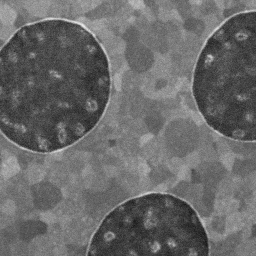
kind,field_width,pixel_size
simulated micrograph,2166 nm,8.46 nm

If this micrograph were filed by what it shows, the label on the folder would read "holes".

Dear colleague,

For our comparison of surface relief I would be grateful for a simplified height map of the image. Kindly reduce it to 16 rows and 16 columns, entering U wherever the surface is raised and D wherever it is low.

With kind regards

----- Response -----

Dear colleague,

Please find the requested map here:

UUUUUUUUUUUUUUUU
UUDDDUUUUUUUUUDD
UDDDDDUUUUUUUDDD
DDDDDDDUUUUUDDDD
DDDDDDDUUUUUDDDD
DDDDDDDUUUUUDDDD
DDDDDDDUUUUUDDDD
DDDDDDUUUUUUUDDD
DDDDDUUUUUUUUUDD
UUDUUUUUUUUUUUUU
UUUUUUUUUUUUUUUU
UUUUUUUUUUUUUUUU
UUUUUUUUDDDUUUUU
UUUUUUUDDDDDUUUU
UUUUUUDDDDDDDUUU
UUUUUDDDDDDDDUUU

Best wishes